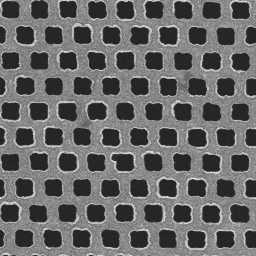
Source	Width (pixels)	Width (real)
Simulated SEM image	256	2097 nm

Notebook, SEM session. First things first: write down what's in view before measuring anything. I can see a regular array of holes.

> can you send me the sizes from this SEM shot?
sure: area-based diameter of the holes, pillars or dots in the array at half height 152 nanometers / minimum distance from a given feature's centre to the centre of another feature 233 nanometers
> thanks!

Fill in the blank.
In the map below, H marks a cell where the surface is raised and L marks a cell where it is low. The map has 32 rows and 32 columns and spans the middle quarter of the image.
LLLHHHLLLLHHHLLLLLHHHLLLLHHHLLLL
HHHHHHHHHHHHHHHHHHHHHHHHHHHHHHHH
HHHHHHHHHHHHHHHHHHHHHHHHHHHHHHHH
HHHLLLHHHHLLLHHHHHHHHHHHHHHHHHHH
HHLLLLLHHLLLLLHHHLLLLHHHLLLLHHHL
HHLLLLLHHLLLLLHHHLLLLHHHLLLLHHHL
HHLLLLLHHLLLLLHHHLLLLHHHLLLLHHHL
HHHLLLLHHHLLLLHHHLLLLHHHLLLLHHHH
HHHHHHHHHHHHHHHHHHHHHHHHHHHHHHHH
HHHHHHHHHHHHHHHHHHHHHHHHHHHHHHHH
LLLHHHLLLLHHHLLLLHHHLLLLLHHHLLLL
LLLHHHLLLLLHHLLLLLHHLLLLLHHHLLLL
LLLHHHLLLLLHHLLLLLHHLLLLLHHHLLLL
LLLHHHLLLLHHHHLLLHHHHLLLLHHHLLLL
HHHHHHHHHHHHHHHHHHHHHHHHHHHHHHHH
HHHHHHHHHHHHHHHHHHHHHHHHHHHHHHHH
HHLLLLHHHHLLLHHHHLLLHHHHLLLLHHHH
HHLLLLLHHHLLLLHHLLLLLHHHLLLLHHHL
HHLLLLLHHHLLLLHHHLLLLHHHLLLLHHHL
HHLLLLLHHHLLLLHHHLLLLHHHLLLLHHHL
HHHHHLHHHHHLLHHHHHHHHHHHHHHLHHHH
HHHHHHHHHHHHHHHHHHHHHHHHHHHHHHHH
LLHHHHHLHHHHHHLLHHHHHLLHHHHHLHHH
LLLHHHLLLLHHLLLLLHHHLLLLHHHLLLLL
LLLHHHLLLLHHHLLLLLHHLLLLLHHLLLLL
LLLHHHLLLLHHHLLLLLHHLLLLLHHLLLLL
LLHHHHLLLLHHHHLLLHHHHLLLHHHHLLLL
HHHHHHHHHHHHHHHHHHHHHHHHHHHHHHHH
HHHHHHHHHHHHHHHHHHHHHHHHHHHHHHHH
HHLLLLLHHHLLLHHHHLLLHHHHLLLLHHHL
HHLLLLLHHLLLLLHHHLLLLHHHLLLLHHHL
HHLLLLLHHLLLLLHHHLLLLHHHLLLLHHHL